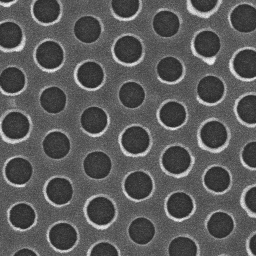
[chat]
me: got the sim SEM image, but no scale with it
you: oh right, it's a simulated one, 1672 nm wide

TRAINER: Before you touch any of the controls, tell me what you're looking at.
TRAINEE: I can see a regular array of holes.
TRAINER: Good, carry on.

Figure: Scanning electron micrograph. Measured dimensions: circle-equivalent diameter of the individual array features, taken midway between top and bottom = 179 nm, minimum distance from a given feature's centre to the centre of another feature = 295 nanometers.